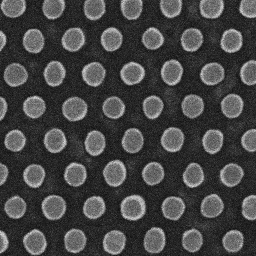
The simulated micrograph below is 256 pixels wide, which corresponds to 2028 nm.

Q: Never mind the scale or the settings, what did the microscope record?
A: a regular array of raised bodies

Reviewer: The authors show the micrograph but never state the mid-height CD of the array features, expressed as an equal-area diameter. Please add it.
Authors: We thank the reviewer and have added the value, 174 nanometres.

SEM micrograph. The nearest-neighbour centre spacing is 0.299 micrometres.